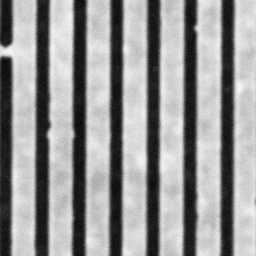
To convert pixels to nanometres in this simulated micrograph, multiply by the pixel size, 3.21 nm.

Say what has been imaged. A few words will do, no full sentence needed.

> parallel lines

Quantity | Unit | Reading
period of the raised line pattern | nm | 118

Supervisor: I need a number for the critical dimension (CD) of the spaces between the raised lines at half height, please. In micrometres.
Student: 0.0437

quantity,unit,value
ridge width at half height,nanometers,74.6